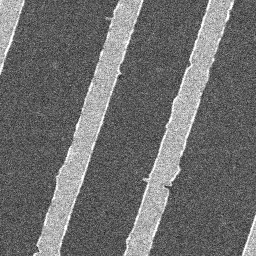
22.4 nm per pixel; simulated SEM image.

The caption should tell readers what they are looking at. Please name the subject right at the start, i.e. one or a few lines or trenches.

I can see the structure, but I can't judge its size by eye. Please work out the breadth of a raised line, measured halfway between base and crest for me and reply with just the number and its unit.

488 nm